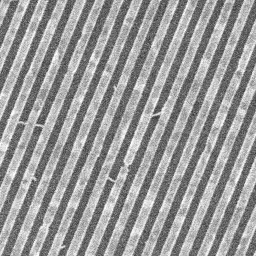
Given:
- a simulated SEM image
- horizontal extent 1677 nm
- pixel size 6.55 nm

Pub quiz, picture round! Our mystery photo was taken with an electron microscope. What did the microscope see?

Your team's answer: parallel lines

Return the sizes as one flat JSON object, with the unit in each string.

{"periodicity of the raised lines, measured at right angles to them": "114 nanometres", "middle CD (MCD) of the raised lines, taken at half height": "50.1 nm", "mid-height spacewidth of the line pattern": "0.0615 µm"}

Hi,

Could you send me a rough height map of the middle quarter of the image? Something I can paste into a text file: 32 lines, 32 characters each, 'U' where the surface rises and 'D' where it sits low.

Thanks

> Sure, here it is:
DUUDDDUUDDDUUDDUUDDDUUDDDUUDDUUD
DUUDDDUUDDUUDDDUUDDDUUDDUUDDDUUD
DUDDDUUDDDUUDDDUDDDUUDDDUUDDDUUD
UUDDDUUDDUUUDDUUDDDUUDDUUDDDUUDD
UUDDUUDDDUUDDDUUDDUUDDDUUDDDUUDD
UDDDUUDDDUUDDUUDDDUUDDDUUDDUUDDD
UDDUUUDDUUDDDUUDDUUUDDUUDDDUUDDD
UDDUUDDDUUDDDUDDDUUDDDUUDDDUUDDU
DDDUUDDUUDDDUUDDDUUDDUUUDDUUDDDU
DDUUDDDUUDDDUUDDUUDDDUUDDDUUDDUU
DDUUDDDUUDDUUDDDUUDDDUUDDUUDDDUU
DUUUDDUUDDDUUDDDUUDDUUDDUUUDDDUU
DUUDDDUUDDDUUDDUUDDDUUDDUUUDDUUD
DUUDDUUDDDUUDDDUUDDUUUDDUUDDDUUD
UUDDDUUDDDUUDDUUUDDUUDDDUUDDUUDD
UUDDDUUDDUUDDDUUDDDUUDDUUDDDUUDD
UDDDUUDDDUUDDDUUDDUUDDDUUDDDUUDD
UDDDUUDDUUUDDUUDDDUUDDUUUDDUUDDD
UDDUUDDDUUDDDUUDDUUDDDUUDDDUUDDU
DDDUUDDDUUDDUUDDDUUDDDUUDDUUDDDU
DDDUUDDUUDDDUUDDDUUDDUUDDDUUDDDU
DDUUDDDUUDDDUUDDUUDDDUUDDDUUDDUU
DDUUDDUUUDDUUDDDUUDDUUUDDUUDDDUU
DUUUDDUUDDDUUDDDUDDDUUDDDUUDDUUU
DUUDDUUUDDUUDDDUUDDUUUDDUUDDDUUD
UUDDDUUDDDUUDDDUDDDUUDDDUUDDUUUD
UUDDDUUDDUUUDDUUDDDUUDDUUDDDUUDD
UUDDUUUDDUUDDDUUDDUUUDDUUDDDUUDD
UDDDUUDDDUUDDUUDDDUUDDDUUDDUUUDD
UDDUUUDDUUDDDUUDDUUUDDUUDDDUUDDD
DDDUUDDDUUDDUUDDDUUDDDUUDDDUDDDU
DDDUUDDUUDDDUUDDDUUDDUUDDDUUDDDU